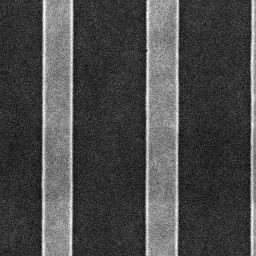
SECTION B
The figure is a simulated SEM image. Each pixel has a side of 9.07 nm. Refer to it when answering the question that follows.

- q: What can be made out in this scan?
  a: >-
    one or a few lines or trenches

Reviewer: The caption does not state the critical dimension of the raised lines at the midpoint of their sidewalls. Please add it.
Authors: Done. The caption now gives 267 nm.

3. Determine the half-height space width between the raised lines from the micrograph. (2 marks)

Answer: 679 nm